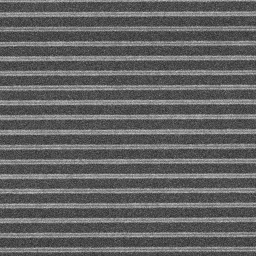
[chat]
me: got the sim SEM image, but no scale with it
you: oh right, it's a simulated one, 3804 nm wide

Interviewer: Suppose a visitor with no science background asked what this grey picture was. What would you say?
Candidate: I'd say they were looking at parallel lines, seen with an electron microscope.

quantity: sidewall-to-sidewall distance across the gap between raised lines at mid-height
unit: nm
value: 171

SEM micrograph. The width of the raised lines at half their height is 39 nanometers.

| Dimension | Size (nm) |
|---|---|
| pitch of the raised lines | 219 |